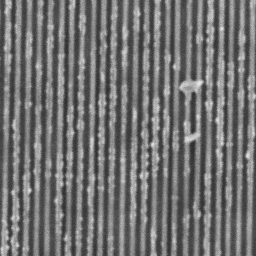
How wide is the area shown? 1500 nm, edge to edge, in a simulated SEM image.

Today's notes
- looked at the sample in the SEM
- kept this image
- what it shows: parallel lines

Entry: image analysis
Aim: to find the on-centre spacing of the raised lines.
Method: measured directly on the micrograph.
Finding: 0.0624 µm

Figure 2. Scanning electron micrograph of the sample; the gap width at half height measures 33.7 nm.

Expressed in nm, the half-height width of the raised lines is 27.8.